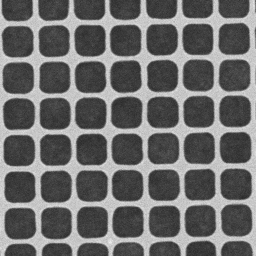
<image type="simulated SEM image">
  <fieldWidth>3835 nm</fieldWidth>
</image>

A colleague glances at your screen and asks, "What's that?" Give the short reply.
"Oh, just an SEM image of a regular array of holes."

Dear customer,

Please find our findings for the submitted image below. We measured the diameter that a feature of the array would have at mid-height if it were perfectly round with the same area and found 512 nanometers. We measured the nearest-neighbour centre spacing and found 538 nanometres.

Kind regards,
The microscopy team